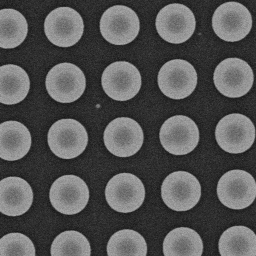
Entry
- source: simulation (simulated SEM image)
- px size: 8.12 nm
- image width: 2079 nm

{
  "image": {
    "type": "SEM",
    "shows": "an array of small figures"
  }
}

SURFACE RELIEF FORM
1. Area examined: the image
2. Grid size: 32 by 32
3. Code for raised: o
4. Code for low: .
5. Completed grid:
.....................o......oo..
oo....oooo...oooo...oooo...oooo.
ooo...oooo...oooo...oooo...oooo.
ooo...oooo...oooo...oooo...oooo.
ooo...oooo...oooo...oooo...oooo.
oo.....oo.....oo................
................................
......................o.....oo..
ooo....ooo...oooo...oooo...oooo.
ooo...ooooo..ooooo..ooooo..ooooo
oooo..ooooo..ooooo..ooooo..ooooo
ooo...oooo...oooo...oooo....ooo.
ooo....oo......o................
................................
......................o.....ooo.
ooo....ooo....ooo...oooo...ooooo
oooo..ooooo..ooooo..ooooo..ooooo
oooo..ooooo..ooooo..ooooo..ooooo
oooo..ooooo..oooo....ooo....ooo.
ooo....ooo.....o................
................................
......................o.....ooo.
ooo....ooo....oooo...oooo..ooooo
oooo..ooooo..ooooo..ooooo..ooooo
oooo..ooooo..ooooo..ooooo..ooooo
oooo..ooooo...oooo...oooo...ooo.
ooo....ooo.....o................
................................
......................oo.....oo.
.oo....oooo...oooo...oooo...oooo
oooo...oooo..ooooo..ooooo..ooooo
oooo..ooooo..ooooo..ooooo..ooooo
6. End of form